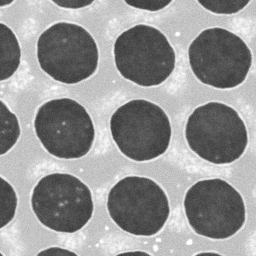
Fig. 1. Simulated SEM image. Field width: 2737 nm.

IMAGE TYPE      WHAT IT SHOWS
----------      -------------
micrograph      a regular array of holes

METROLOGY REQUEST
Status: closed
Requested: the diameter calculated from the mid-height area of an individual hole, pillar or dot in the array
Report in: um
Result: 0.658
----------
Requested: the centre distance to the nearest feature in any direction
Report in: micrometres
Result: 0.801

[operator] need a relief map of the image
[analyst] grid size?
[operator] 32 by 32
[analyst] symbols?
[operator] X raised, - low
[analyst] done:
-XXXXXX----XXXXX-----XXXX------X
XXXXXXXXXXXXXXXXXXXXXXXXXX----XX
XXXXXXXXXXXXXXXXXXXXXXXXXXXXXXXX
-XXXXX-----XXXXX---XXXXXXX--XXXX
--XXX-------XXX------XXXX-----XX
--XXX-------XX-------XXX-------X
---XX-------XX--------X--------X
---XX-------XX--------XX-------X
--XXX-------XXX-------XX-------X
--XXXX-----XXXX------XXX-------X
XXXXXXXX-XXXXXXXX---XXXXX-----XX
XXXXXXXXXXXXXXXXXXXXXXXXXXXXXXXX
XXXXXX---XXXXXXXX-XXXXXXXXXXXXXX
-XXXX------XXXX-----XXXXX----XXX
--XX-------XXX-------XXX------XX
--XX--------XX-------XX--------X
---X--------XX-------XX--------X
--XXX-------XX-------XX--------X
-XXXXX-----XXXX------XXX-------X
XXXXXXX----XXXXX----XXXXX-----XX
XXXXXXXXXXXXXXXXXXXXXXXXXXX-XXXX
XXXXXXXXXXXXXXXXXXXXXXXXXXXXXXXX
-XXXX-----XXXXX----XXXXXX---XXXX
--XX-------XXX------XXXX-----XXX
--XX-------XXX-------XX-------XX
--XX--------X--------XX--------X
--XX--------XX-------XX--------X
-XXXX------XXX-------XX--------X
XXXXXX----XXXXX-----XXXX------XX
XXXXXXXXXXXXXXXXXX-XXXXXX----XXX
XXXXXXXXXXXXXXXXXXXXXXXXXXXXXXXX
XXXXX----XXXXXXX--XXXXXXXX-XXXXX